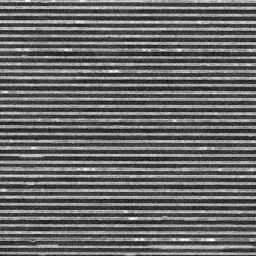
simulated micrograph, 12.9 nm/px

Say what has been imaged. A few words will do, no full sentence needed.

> parallel lines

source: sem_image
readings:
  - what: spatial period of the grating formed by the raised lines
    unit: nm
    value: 90.9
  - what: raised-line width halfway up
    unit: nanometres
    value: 25.9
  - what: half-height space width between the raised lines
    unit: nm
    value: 63.1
